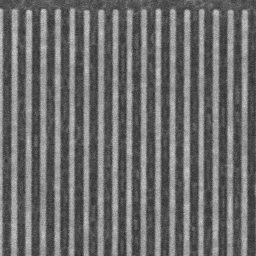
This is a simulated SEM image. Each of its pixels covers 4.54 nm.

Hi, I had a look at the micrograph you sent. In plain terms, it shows parallel lines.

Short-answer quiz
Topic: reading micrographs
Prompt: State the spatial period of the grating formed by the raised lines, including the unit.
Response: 65.5 nm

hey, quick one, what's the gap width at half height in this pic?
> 0.0398 microns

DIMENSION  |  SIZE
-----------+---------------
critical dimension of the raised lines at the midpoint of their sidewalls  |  0.0239 micrometres